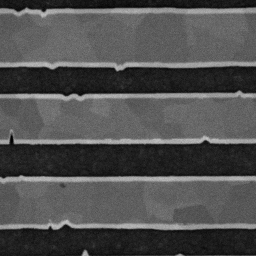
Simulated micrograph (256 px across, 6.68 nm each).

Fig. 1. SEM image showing one or a few lines or trenches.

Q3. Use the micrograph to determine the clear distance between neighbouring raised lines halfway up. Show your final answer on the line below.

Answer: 214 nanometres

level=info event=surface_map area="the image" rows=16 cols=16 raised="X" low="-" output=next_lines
----------------
XXXXXXXXXXXXXXXX
XXXXXXXXXXXXXXXX
XXXXXXXXXXXXXXXX
----------------
----------------
XXXXXXXXXXXXXXXX
XXXXXXXXXXXXXXXX
XXXXXXXXXXXXXXXX
----------------
----------------
XXXXXXXXXXXXXXXX
XXXXXXXXXXXXXXXX
XXXXXXXXXXXXXXXX
----------------
----------------